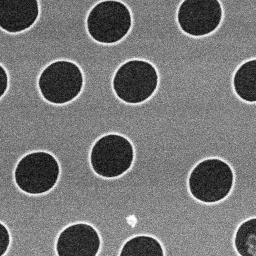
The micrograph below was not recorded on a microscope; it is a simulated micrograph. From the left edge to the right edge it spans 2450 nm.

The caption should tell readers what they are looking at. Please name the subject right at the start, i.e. holes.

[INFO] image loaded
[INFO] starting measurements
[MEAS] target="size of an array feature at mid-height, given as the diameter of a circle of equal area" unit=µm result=0.412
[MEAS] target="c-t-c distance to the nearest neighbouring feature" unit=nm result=734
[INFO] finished